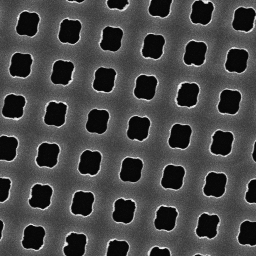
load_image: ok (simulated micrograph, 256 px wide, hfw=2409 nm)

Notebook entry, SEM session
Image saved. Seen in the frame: a regular array of holes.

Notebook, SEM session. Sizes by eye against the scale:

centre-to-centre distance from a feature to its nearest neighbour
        392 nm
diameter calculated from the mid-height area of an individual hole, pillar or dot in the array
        224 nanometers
